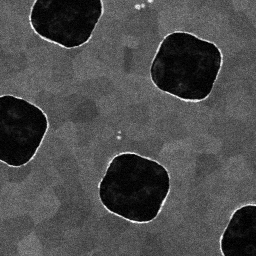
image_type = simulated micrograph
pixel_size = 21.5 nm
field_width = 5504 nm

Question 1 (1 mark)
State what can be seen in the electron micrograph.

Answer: holes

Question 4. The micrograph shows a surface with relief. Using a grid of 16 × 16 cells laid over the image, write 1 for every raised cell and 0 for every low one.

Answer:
1100001111111111
1100001111111111
1110011111000111
1111111111000011
1111111111000011
1111111111000111
0011111111111111
0001111111111111
0001111111111111
0011111111111111
1111111000111111
1111110000011111
1111110000111111
1111111100111110
1111111111111100
1111111111111100